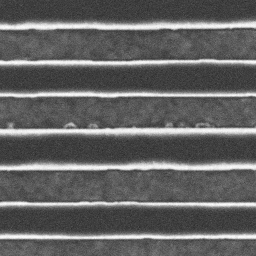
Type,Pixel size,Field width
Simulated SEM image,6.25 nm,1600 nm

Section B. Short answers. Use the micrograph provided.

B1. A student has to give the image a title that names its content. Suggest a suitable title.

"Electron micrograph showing lines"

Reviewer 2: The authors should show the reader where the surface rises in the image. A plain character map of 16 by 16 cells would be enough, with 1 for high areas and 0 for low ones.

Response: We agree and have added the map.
1111111111111111
1111111111111111
0000000000000000
0000000000000000
1111111111111111
1111111111111111
0000000000000000
0000000000000000
1111111111111111
1111111111111111
1111111111111111
0000000000000000
0000000000000000
1111111111111111
1111111111111111
0000000000000000